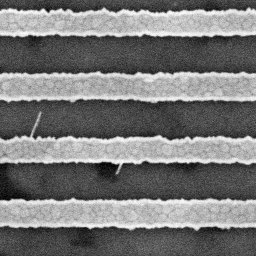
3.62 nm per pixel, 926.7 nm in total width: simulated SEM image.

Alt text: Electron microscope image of lines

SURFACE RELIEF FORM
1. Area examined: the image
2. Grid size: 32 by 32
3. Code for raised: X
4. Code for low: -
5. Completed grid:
--------------------------------
XXXXXXXXX--XXX-XXXX----XXXXXXXXX
XXXXXXXXXXXXXXXXXXXXXXXXXXXXXXXX
XXXXXXXXXXXXXXXXXXXXXXXXXXXXXXXX
--------------------------------
--------------------------------
--------------------------------
--------------------------------
--------------------------------
XXXXXXXXXXXXXXXXXXXXXXXXXXXXXXXX
XXXXXXXXXXXXXXXXXXXXXXXXXXXXXXXX
XXXXXXXXXXXXXXXXXXXXXXXXXXXXXXXX
------------------XXX-------X--X
--------------------------------
--------------------------------
--------------------------------
--------------------------------
-XXXXXXXXXXXXXXXXXXXX-XXXXXXXXXX
XXXXXXXXXXXXXXXXXXXXXXXXXXXXXXXX
XXXXXXXXXXXXXXXXXXXXXXXXXXXXXXXX
--------------------------------
--------------------------------
--------------------------------
--------------------------------
--------------------------------
XXXXXXXXXXXXXXXXXXXXXXXXXXXXXXXX
XXXXXXXXXXXXXXXXXXXXXXXXXXXXXXXX
XXXXXXXXXXXXXXXXXXXXXXXXXXXXXXXX
------------------X-------------
--------------------------------
--------------------------------
--------------------------------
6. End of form